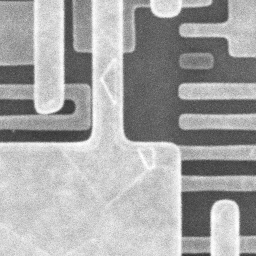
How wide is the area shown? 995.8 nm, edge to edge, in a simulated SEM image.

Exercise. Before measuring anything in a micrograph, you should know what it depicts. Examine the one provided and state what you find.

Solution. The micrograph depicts wiring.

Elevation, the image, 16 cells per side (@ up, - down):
--@@--@@-@@-----
--@@--@@--------
--@@--@@--------
--@@--@@--------
--@@--@@--------
--@@--@@--------
--@@--@@--------
------@@--------
------@@--------
@@@@@@@@@@@-----
@@@@@@@@@@@-----
@@@@@@@@@@@-----
@@@@@@@@@@@-----
@@@@@@@@@@@--@@-
@@@@@@@@@@@--@@-
@@@@@@@@@@@--@@-